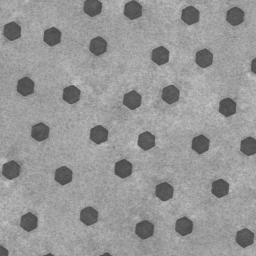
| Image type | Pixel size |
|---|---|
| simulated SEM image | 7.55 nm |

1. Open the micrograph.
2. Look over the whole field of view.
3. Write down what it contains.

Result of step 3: a regular array of holes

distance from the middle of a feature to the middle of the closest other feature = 340 nm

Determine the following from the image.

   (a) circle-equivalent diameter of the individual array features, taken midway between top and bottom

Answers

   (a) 142 nanometers